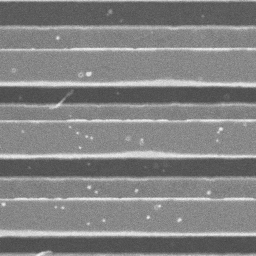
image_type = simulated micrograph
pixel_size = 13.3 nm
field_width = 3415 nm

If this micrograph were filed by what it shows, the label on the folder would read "lines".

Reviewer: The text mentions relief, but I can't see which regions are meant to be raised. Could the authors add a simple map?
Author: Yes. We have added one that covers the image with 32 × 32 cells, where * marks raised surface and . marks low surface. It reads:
................................
................................
................................
********************************
********************************
********************************
********************************
********************************
********************************
********************************
********************************
................................
................................
********************************
********************************
********************************
********************************
********************************
********************************
********************************
................................
................................
********************************
********************************
********************************
********************************
********************************
********************************
********************************
*.****.*..........**............
................................
................................